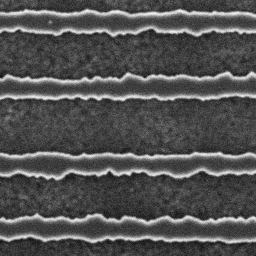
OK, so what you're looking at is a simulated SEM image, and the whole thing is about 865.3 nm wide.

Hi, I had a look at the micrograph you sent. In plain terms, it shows lines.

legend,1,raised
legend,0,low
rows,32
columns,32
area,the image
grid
00000000000000000000000000000000
00111110001100110000011110000000
11111111111111111111111111111111
11111111111111111111111111111111
00000000000000000000000000000000
00000000000000000000000000000000
00000000000000000000000000000000
00000000000000000000000000000000
00000000000000000000000000000000
00000000000000001001101100011001
11111111111111111111111111111111
11111111111111111111111111111111
00000000000000000000100000000000
00000000000000000000000000000000
00000000000000000000000000000000
00000000000000000000000000000000
00000000000000000000000000000000
00000000000000000000000000000000
00000000000000000000000000000000
11111111101111111001111111111111
11111111111111111111111111111111
11111111111111111111111110111111
00000000000000000000000000000000
00000000000000000000000000000000
00000000000000000000000000000000
00000000000000000000000000000000
00000000000000000000000000000000
11111111111111111101111110111111
11111111111111111111111111111111
11111111111111111111111111111111
00000000000000000000000000000000
00000000000000000000000000000000